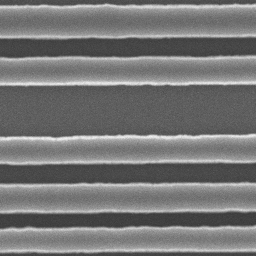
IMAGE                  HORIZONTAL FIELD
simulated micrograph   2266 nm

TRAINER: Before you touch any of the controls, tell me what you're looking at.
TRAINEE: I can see lines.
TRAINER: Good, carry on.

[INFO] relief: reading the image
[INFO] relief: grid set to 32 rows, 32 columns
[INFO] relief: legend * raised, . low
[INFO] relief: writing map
................................
********************************
********************************
********************************
********************************
................................
................................
********************************
********************************
********************************
****.***........................
................................
................................
................................
................................
................................
................................
********************************
********************************
********************************
................................
................................
................................
********************************
********************************
********************************
*************.*******...........
................................
...*............****************
********************************
********************************
................................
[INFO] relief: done